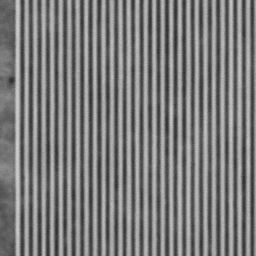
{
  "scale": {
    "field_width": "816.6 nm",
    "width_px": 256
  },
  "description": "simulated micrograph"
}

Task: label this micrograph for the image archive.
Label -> parallel lines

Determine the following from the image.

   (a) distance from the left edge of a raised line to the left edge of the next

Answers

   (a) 27.1 nm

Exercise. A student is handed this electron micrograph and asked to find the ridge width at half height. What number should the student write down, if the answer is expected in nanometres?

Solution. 12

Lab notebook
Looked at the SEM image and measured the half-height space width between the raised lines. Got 15.1 nm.